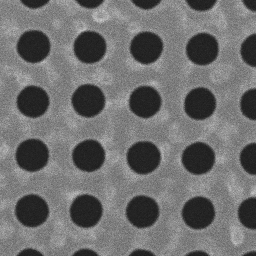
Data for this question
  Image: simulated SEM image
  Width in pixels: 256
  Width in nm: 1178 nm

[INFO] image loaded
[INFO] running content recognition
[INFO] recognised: a regular array of holes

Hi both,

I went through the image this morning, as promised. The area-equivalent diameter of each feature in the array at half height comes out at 152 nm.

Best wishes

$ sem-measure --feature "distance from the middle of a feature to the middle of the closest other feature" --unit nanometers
249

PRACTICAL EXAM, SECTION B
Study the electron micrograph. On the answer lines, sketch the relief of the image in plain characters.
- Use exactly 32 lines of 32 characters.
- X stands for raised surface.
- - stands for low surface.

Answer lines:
XXX---XXXX---XXXX---XXXX---XXXX-
XXXXXXXXXXXXXXXXXXXXXXXXXXXXXXXX
XXXXXXXXXXXXXXXXXXXXXXXXXXXXXXXX
XXXXXXXXXXXXXXXXXXXXXXXXXXXXXXXX
XXX---XXXX---XXXX---XXXX--XXXXX-
XX----XXX----XXX----XXX----XXX--
XX----XXX----XXX----XXX----XXX--
XXX--XXXXX--XXXXX---XXXX---XXX--
XXXXXXXXXXXXXXXXXXXXXXXXXXXXXXXX
XXXXXXXXXXXXXXXXXXXXXXXXXXXXXXXX
XXXXXXXXXXXXXXXXXXXXXXXXXXXXXXXX
XXX---XXX----XXXX---XXXX--XXXXX-
XX----XXX----XXX----XXX----XXX--
XX----XXX----XXX----XXX----XXX--
XXX--XXXXX--XXXXX--XXXXX--XXXXX-
XXXXXXXXXXXXXXXXXXXXXXXXXXXXXXXX
XXXXXXXXXXXXXXXXXXXXXXXXXXXXXXXX
XXX--XXXXXX-XXXXXXXXXXXXXXXXXXXX
XX----XXX----XXX----XXX---XXXXX-
XX----XXX----XXX----XXX----XXX--
XX----XXX----XXX----XXX----XXX--
XXXXXXXXXXXXXXXXX--XXXXX--XXXXX-
XXXXXXXXXXXXXXXXXXXXXXXXXXXXXXXX
XXXXXXXXXXXXXXXXXXXXXXXXXXXXXXXX
XXX--XXXXX--XXXXX-XXXXXXXXXXXXXX
XX----XXX----XXX----XXX----XXX--
XX----XXX----XXX----XXX----XXX--
XX----XXX---XXXX----XXX----XXX--
XXXXXXXXXXXXXXXXXXXXXXXX-XXXXXX-
XXXXXXXXXXXXXXXXXXXXXXXXXXXXXXXX
XXXXXXXXXXXXXXXXXXXXXXXXXXXXXXXX
XXX--XXXX---XXXXX--XXXXX-XXXXXX-